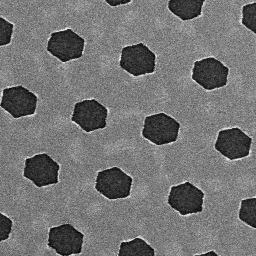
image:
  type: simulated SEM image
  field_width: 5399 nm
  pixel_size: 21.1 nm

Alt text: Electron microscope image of a regular array of holes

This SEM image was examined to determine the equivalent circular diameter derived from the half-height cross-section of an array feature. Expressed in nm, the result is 720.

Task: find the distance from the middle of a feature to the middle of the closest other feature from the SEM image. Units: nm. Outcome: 1530